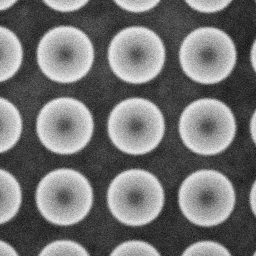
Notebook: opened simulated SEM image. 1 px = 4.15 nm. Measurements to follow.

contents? an array of small figures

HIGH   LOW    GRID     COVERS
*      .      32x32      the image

**....*****....*****....****....
................................
................................
*......**.......**..............
**....*****....*****...*****....
***..******...******...******...
***..*******..*******..******..*
***..*******..******...******..*
**...******...******...******...
*.....****.....****.....****....
................................
................................
*......**.......**.......**.....
**...******...******...*****....
**...******...******...******...
***..*******..******..*******..*
***..******...******..*******..*
**...******...******...******...
*.....****.....****.....****....
................................
................................
*.....****......**.......**.....
**...******...******...******...
**...******...******...******...
***..*******..******..*******..*
***..******...******..*******..*
**...******...******...******...
*.....****.....****.....****....
................................
................................
*.....****.....***......***.....
**...******...******...*****....